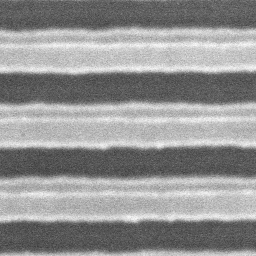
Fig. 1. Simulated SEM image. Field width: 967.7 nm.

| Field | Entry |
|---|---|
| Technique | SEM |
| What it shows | lines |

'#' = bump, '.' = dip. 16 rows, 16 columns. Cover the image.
................
................
################
################
....#...........
................
................
################
################
................
................
################
################
################
................
................